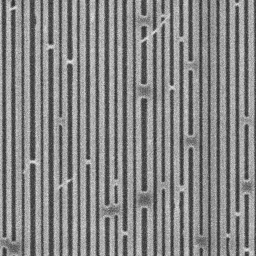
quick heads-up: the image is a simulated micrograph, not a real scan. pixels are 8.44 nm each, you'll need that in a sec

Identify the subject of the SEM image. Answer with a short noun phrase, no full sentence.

parallel lines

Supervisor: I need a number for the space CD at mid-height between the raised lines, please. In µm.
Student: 0.0359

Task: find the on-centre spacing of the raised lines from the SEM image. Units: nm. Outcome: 78.8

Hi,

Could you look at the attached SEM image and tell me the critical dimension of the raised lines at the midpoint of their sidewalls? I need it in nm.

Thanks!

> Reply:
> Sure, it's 43.3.